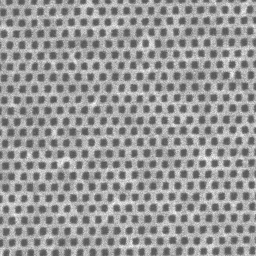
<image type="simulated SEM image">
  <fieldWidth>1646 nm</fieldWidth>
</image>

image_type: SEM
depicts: a regular array of holes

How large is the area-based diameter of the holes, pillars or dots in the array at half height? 55.7 nanometers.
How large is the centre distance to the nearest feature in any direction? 12.1 pixels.